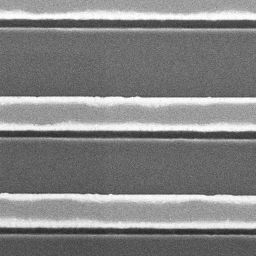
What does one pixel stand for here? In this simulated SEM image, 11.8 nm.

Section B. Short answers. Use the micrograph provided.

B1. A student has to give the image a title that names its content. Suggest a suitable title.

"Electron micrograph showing lines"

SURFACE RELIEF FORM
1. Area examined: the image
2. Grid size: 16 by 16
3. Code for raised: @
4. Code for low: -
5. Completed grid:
@@@@@@@@@@@@@@@@
----------------
----------------
----------------
----------------
----------------
@@@@@@@@@@@@@@@@
@@@@@@@@@@@@@@@@
----------------
----------------
----------------
----------------
@@@@@@@@@@@@@@@@
@@@@@@@@@@@@@@@@
----------------
----------------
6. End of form